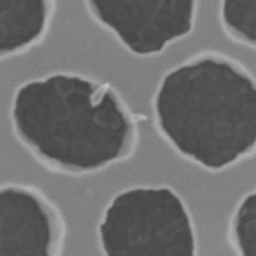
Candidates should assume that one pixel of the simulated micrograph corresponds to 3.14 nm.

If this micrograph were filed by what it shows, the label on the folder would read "holes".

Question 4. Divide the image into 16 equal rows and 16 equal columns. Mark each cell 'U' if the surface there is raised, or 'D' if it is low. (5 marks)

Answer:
DDDUUUDDDDDDUUDD
DDDUUUUDDDDDUUDD
DDUUUUUUDDDUUUUD
UUUUUUUUUUUUUUUU
UUUUUUUUUUUDDDDU
UUDDDDUUUUDDDDDD
UDDDDDDUUUDDDDDD
UDDDDDDDUUDDDDDD
UDDDDDDDUUUDDDDD
UUUDDDDDUUUDDDDU
UUUUDDUUUUUUUUUU
UUUUUUUUUUUUUUUU
DDUUUUUDDDDUUUUD
DDDUUUUDDDDDUUUD
DDDDUUDDDDDDUUUD
DDDUUUUDDDDDUUUD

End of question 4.